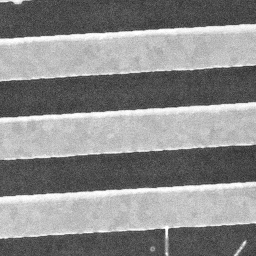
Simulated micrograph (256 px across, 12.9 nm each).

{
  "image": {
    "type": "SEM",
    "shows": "lines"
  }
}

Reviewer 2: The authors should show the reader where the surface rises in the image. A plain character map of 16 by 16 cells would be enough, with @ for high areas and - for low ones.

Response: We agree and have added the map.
----------------
----------------
@@@@@@@@@@@@@@@@
@@@@@@@@@@@@@@@@
@@@@@@@@@-------
----------------
---------------@
@@@@@@@@@@@@@@@@
@@@@@@@@@@@@@@@@
@@@@@@@@--------
----------------
---------------@
@@@@@@@@@@@@@@@@
@@@@@@@@@@@@@@@@
@@@@@@----------
----------------